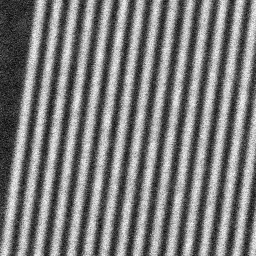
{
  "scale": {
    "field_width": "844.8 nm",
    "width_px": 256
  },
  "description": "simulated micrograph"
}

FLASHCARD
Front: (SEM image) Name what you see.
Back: parallel lines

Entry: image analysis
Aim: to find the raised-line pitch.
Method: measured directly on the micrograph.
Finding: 16.4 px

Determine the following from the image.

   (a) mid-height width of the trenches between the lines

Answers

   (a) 0.0294 microns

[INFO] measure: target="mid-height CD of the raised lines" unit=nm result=23.7